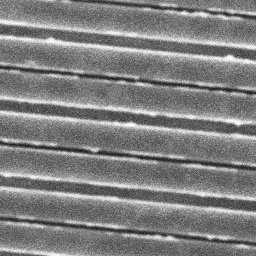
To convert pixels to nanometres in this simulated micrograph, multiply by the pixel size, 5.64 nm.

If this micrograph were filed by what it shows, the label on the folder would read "parallel lines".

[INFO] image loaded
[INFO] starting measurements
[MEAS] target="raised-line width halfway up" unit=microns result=0.165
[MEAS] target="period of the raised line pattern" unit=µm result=0.215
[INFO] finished